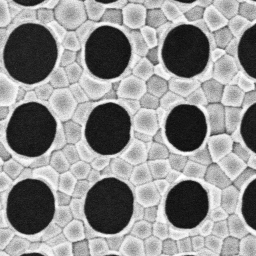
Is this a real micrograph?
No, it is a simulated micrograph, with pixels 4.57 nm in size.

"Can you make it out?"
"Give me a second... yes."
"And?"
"a regular array of holes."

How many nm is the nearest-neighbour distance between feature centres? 350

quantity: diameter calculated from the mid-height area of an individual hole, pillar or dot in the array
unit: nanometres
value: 233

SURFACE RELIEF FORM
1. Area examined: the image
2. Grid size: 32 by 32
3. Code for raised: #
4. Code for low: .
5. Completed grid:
##...###########################
################################
################################
##....######..########...######.
#......####.....#####.....####..
#......####.....####......####..
.......####.....####......####..
.......####.....####......####..
#......####.....#####.....####..
#.....######...#######..#######.
###.############################
################################
################################
##....######....######...######.
#......####.....#####.....####..
#......####.....#####.....####..
#......####.....#####.....####..
#......####.....#####.....####..
#.....#####....#######...######.
###..###########################
################################
################################
###..#######...########.########
#.....#####.....#####.....#####.
#......####......####.....####..
#......####......####.....####..
#......####......####.....####..
#......####.....#####....######.
##....#####....#######..#######.
################################
################################
################################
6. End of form